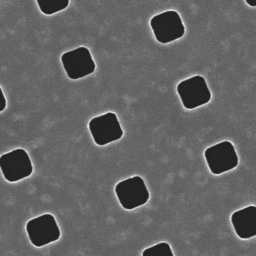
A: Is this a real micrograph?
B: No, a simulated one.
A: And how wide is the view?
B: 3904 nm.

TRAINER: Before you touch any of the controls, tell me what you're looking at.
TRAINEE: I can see holes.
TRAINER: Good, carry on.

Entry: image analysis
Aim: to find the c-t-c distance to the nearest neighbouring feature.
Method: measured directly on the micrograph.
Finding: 1080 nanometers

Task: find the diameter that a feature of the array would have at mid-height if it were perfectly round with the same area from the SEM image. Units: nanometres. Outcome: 485